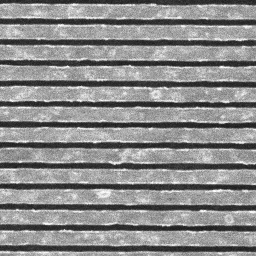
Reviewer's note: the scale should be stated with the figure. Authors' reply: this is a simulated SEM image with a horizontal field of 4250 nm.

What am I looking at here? parallel lines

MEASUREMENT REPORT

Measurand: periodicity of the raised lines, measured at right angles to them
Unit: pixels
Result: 20.6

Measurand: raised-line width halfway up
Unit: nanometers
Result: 241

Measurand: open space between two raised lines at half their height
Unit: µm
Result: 0.106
